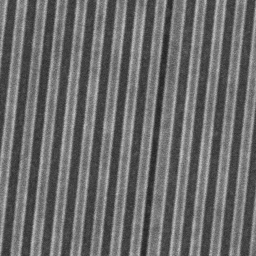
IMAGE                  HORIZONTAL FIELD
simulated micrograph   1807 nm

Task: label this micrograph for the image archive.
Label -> parallel lines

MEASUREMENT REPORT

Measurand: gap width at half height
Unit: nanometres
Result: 75.4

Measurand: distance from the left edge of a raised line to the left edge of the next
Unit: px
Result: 19.8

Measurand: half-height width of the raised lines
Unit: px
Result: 9.82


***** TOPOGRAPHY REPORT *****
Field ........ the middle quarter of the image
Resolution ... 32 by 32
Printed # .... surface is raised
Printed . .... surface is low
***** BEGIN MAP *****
..##...##...##..###...##..###...
..##...##...##..###...##..###..#
.###..###...##..###..##...##...#
.###..###..###..##...##...##...#
.##...##...##...##...##..###...#
.##...##...##...##...##..###...#
.##...##...##...##...##..###...#
.##...##...##...##...##..###...#
.##...##...##...##...##..###...#
.##...##...##...##...##..###...#
.##...##...##..###...##..###..##
.##..###...##..###..###..##...##
###..###...##..###..##...##...##
###..###..##...##...##..###...##
###..##...##...##...##..###...##
##...##...##...##...##..###...##
##...##...##...##...##..###...##
##...##...##...##...##..###...##
##...##...##...##...##..###...##
##...##...##..###...##..###...##
##...##...##..###..###..###..###
##..###..###..###..##...##...###
##..###..###..##...##...##...##.
##..##...##...##...##..###...##.
#...##...##...##...##..###...##.
#...##...##...##...##..###...##.
#...##...##...##...##..###...##.
#...##...##...##...##..###...##.
#...##...##...##...##..###...##.
#...##...##..###..###..###..###.
#..###...##..###..###..##...###.
#..###...##..###..##...##...###.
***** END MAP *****